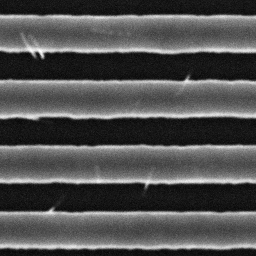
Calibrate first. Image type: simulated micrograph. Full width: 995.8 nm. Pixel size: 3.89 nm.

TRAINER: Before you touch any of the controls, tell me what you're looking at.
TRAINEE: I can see lines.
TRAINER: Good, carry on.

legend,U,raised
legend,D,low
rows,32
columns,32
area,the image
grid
DDDDDDDDDDDDDDDDDDDDDDDDDDDDDDDD
DDDDDDDDDDDDDDDDDDDDDDDDDDDDDDDD
UUUUUUUUUUUUUUUUUUUUUUUUUUUUUUUU
UUUUUUUUUUUUUUUUUUUUUUUUUUUUUUUU
UUUUUUUUUUUUUUUUUUUUUUUUUUUUUUUU
UUUUUUUUUUUUUUUUUUUUUUUUUUUUUUUU
DUUDUUUDDUUUUUUUUDUUUUUUUDDUUUUU
DDDDDDDDDDDDDDDDDDDDDDDDDDDDDDDD
DDDDDDDDDDDDDDDDDDDDDDDDDDDDDDDD
DDDDDDDDDDDDDDDDDDDDDDDDDDDDDDDD
UUUUUUUUUUUUUUUUUUUUUUUUUUUUUUUU
UUUUUUUUUUUUUUUUUUUUUUUUUUUUUUUU
UUUUUUUUUUUUUUUUUUUUUUUUUUUUUUUU
UUUUUUUUUUUUUUUUUUUUUUUUUUUUUUUU
UUUUUUUUUUUUUUUUUUUUUUUUUUUUDUUU
DDDDDDDDDDDDDDDDDDDDDDDDDDDDDDDD
DDDDDDDDDDDDDDDDDDDDDDDDDDDDDDDD
DDDDDDDDDDDDDDDDDDDDDDDDDDDDDDDD
UUUUUUUUUUUUUUUUUUUUUUUUUUUUUUUU
UUUUUUUUUUUUUUUUUUUUUUUUUUUUUUUU
UUUUUUUUUUUUUUUUUUUUUUUUUUUUUUUU
UUUUUUUUUUUUUUUUUUUUUUUUUUUUUUUU
UUUUUUUUUUUUUUUUUUUUUUUUUUUUUUUU
DDDDDDDDDDDDDDDDDDDDDDDDDDDDDDDD
DDDDDDDDDDDDDDDDDDDDDDDDDDDDDDDD
DDDDDDDDDDDDDDDDDDDDDDDDDDDDDDDD
DDDDDDUDDDDDDDDDDDDDDDDDDDDDDDDD
UUUUUUUUUUUUUUUUUUUUUUUUUUUUUUUU
UUUUUUUUUUUUUUUUUUUUUUUUUUUUUUUU
UUUUUUUUUUUUUUUUUUUUUUUUUUUUUUUU
UUUUUUUUUUUUUUUUUUUUUUUUUUUUUUUU
DDDDDDDDDDDDDDDDDDDDDDDDDDDDDDDD